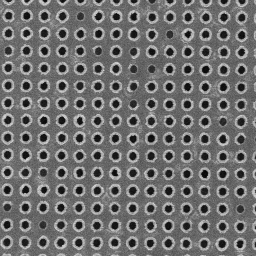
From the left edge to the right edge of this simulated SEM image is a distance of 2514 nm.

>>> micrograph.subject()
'a regular array of holes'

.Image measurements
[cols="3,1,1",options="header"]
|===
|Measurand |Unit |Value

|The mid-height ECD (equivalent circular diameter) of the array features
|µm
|0.0744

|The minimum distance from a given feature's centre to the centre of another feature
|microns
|0.168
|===